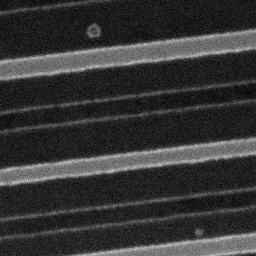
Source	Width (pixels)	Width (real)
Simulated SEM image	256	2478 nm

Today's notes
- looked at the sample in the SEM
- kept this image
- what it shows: lines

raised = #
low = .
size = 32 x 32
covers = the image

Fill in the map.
#########.......................
#...............................
................................
................................
..........................######
..................##############
..........##################....
..##################............
###########.....................
####............................
.............................###
....................############
.............###################
....####################........
################................
########........................
................................
...............................#
......................##########
..............###############...
.......##############...........
##############..................
#####...........................
................................
........................########
................################
........###################.....
###################.............
###########.....................
###...........................##
......................##########
.............##################.